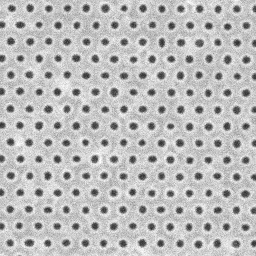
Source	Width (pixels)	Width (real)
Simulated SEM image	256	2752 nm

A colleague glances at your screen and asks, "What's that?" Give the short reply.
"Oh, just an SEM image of a regular array of holes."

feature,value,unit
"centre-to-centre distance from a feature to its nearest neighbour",0.199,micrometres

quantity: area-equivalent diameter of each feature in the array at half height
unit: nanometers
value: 93.9